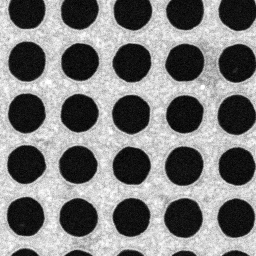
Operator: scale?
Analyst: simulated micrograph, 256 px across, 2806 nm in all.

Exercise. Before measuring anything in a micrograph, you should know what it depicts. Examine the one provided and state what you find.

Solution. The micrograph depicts a regular array of holes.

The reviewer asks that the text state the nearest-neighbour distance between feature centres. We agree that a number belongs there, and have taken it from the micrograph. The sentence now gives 0.565 micrometres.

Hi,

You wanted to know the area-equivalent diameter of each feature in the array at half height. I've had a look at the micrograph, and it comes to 424 nm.